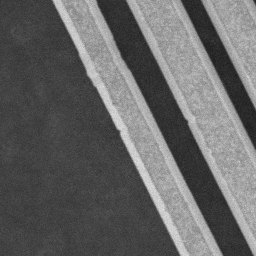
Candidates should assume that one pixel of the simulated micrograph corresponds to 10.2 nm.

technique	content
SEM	one or a few lines or trenches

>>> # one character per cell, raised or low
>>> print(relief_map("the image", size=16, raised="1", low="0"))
0000110011100111
0000110001110011
0000011001110011
0000011000111001
0000001100111001
0000001100011100
0000000110011100
0000000110001110
0000000011001110
0000000011000111
0000000001100111
0000000001100011
0000000000110011
0000000000110001
0000000000011001
0000000000011000